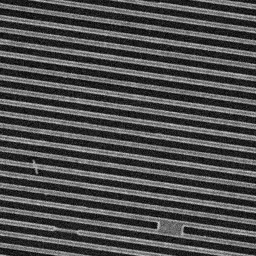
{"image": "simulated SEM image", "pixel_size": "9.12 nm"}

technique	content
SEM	parallel lines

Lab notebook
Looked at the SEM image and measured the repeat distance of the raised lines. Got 108 nm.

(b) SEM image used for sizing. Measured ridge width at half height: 34.9 nanometres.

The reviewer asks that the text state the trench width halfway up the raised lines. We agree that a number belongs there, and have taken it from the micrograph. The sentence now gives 70 nm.